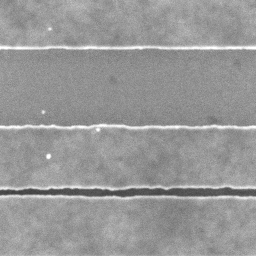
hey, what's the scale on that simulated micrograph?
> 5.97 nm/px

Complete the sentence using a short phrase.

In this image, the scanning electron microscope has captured lines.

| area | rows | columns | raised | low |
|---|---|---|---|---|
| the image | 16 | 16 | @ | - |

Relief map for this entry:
@@@@@@@@@@@@@@@@
@@@@@@@@@@@@@@@@
@@@@@@@@@@@@@@@@
----------------
----------------
----------------
----------------
----------------
@@@@@@@@@@@@@@@@
@@@@@@@@@@@@@@@@
@@@@@@@@@@@@@@@@
@@@@@@@@@@@@@@@@
@@@@@@@@@@@@@@@@
@@@@@@@@@@@@@@@@
@@@@@@@@@@@@@@@@
@@@@@@@@@@@@@@@@